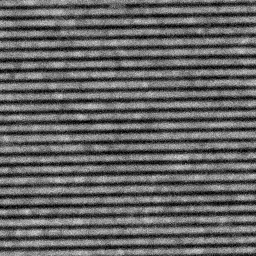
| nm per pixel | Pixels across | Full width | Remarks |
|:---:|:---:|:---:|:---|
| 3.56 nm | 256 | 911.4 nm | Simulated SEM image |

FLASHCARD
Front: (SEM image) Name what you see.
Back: parallel lines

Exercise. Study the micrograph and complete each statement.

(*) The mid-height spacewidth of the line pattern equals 21.3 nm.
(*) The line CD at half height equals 18.2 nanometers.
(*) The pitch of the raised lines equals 0.0373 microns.